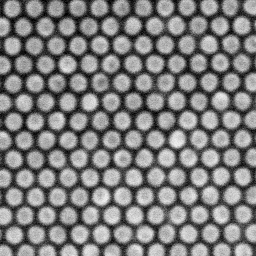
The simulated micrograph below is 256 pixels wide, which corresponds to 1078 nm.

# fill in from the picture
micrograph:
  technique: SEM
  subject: a regular array of raised bodies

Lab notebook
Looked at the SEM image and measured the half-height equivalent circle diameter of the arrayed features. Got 66.4 nanometers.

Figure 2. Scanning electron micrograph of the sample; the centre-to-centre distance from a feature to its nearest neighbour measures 0.0902 microns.